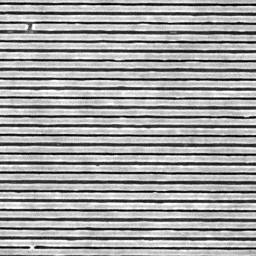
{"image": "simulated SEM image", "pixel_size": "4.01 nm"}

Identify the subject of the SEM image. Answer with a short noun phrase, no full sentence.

parallel lines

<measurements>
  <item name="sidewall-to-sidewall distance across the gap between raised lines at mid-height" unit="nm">11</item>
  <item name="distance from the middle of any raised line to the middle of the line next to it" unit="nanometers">37.6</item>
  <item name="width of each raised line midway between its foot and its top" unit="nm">25.6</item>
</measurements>